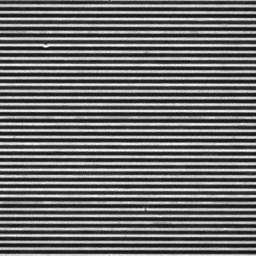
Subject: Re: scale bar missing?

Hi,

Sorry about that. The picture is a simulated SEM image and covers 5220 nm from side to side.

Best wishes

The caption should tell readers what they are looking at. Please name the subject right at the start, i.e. parallel lines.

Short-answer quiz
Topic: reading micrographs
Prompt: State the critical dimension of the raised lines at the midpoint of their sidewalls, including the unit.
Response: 58.6 nanometres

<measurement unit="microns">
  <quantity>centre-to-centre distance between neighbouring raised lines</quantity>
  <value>0.134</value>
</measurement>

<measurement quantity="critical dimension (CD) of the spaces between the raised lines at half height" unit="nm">79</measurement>